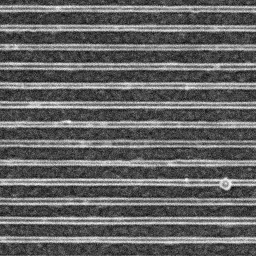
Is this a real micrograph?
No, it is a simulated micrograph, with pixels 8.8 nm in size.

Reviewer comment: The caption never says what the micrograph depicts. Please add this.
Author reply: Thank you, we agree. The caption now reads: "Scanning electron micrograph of parallel lines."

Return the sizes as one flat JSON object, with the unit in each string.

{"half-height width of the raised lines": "44 nanometres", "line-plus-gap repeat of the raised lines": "169 nm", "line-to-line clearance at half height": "14.2 px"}